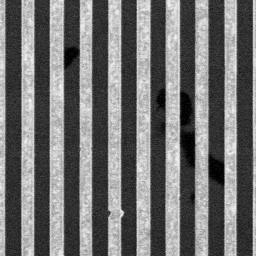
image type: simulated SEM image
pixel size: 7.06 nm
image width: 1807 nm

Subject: parallel lines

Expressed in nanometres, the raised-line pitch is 204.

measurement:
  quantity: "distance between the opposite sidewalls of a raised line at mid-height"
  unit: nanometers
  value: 86.5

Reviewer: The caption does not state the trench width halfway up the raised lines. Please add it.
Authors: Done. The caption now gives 17 pixels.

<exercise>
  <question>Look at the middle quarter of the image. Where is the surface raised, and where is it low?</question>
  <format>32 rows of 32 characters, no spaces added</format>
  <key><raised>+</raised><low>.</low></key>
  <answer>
....+++....+++....+++.....+++...
....+++....+++....+++.....+++...
....+++....+++....+++.....+++...
....+++....+++....+++.....+++...
....+++....+++....+++.....+++...
....+++....+++....+++.....+++...
....+++....+++....+++.....+++...
....+++....+++....+++.....+++...
....+++....+++....+++.....+++...
....+++....+++....+++.....+++...
....+++....+++....+++.....+++...
....+++....+++....+++.....+++...
....+++....+++....+++.....+++...
....+++....+++....+++.....+++...
....+++....+++....+++.....+++...
....+++....+++....+++.....+++...
....+++....+++....+++.....+++...
....+++....+++....+++.....+++...
....+++....+++....+++.....+++...
....+++....+++....+++.....+++...
....+++....+++....+++.....+++...
....+++....+++....+++.....+++...
....+++....+++....+++.....+++...
....+++....+++....+++.....+++...
....+++....+++....+++.....+++...
....+++....+++....+++.....+++...
....+++....+++....+++.....+++...
....+++....+++....+++.....+++...
....+++....+++....+++.....+++...
....+++....+++....+++.....+++...
....+++....+++....+++.....+++...
....+++....+++....+++.....+++...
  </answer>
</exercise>